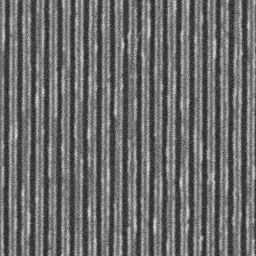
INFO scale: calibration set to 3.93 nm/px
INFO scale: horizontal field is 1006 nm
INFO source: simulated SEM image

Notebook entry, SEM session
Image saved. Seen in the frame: parallel lines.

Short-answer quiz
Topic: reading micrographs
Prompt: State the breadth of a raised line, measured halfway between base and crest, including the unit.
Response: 27.5 nanometres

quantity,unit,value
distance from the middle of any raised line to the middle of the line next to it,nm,51.9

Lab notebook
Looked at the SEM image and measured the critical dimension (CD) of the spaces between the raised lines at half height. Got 23.6 nm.